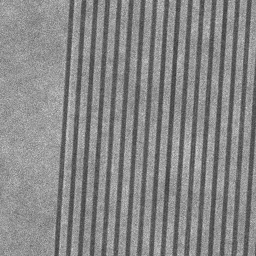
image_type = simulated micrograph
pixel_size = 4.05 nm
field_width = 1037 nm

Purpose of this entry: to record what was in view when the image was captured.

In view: parallel lines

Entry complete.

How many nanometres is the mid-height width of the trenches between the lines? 18.2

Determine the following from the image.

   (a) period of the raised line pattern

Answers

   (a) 47.8 nm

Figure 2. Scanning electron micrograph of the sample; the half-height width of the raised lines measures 28.8 nanometres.